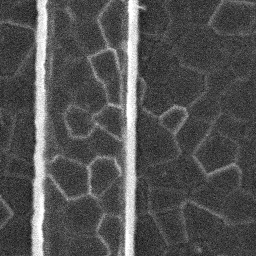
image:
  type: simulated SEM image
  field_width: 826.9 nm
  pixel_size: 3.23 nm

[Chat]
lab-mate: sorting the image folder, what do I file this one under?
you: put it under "one or a few lines or trenches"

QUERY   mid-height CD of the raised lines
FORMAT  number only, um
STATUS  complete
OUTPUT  0.3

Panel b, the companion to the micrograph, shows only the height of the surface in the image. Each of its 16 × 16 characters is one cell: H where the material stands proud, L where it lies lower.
LLLHHHHHLLLLLLLL
LLLHHHHHLLLLLLLL
LLLHHHHHLLLLLLLL
LLLHHHHHLLLLLLLL
LLHHHHHHLLLLLLLL
LLHHHHHHLLLLLLLL
LLHHHHHHLLLLLLLL
LLHHHHHHLLLLLLLL
LLLHHHHHLLLLLLLL
LLHHHHHHLLLLLLLL
LLHHHHHHLLLLLLLL
LLHHHHHHLLLLLLLL
LLHHHHHHLLLLLLLL
LLHHHHHHLLLLLLLL
LLHHHHHHLLLLLLLL
LLHHHHHHLLLLLLLL